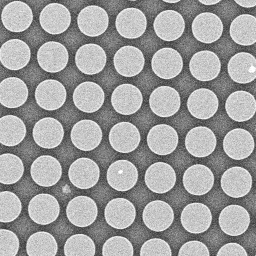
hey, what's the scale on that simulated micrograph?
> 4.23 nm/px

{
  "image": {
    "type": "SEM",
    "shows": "an array of small figures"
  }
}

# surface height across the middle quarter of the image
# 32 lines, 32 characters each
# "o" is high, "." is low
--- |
...ooooooo...ooooooo..ooooooo..o
....ooooo....oooooo...ooooooo...
......o.......oooo.....ooooo....
........................ooo.....
......o.........................
....ooooo.....oooo..............
...ooooooo...oooooo....ooooo....
..oooooooo..ooooooo...oooooo....
..oooooooo..oooooooo.oooooooo..o
..oooooooo..ooooooo..oooooooo..o
...oooooo...ooooooo...ooooooo..o
....oooo.....ooooo....oooooo...o
...............oo......oooo.....
................................
....ooo.........................
..ooooooo....ooooo.....ooo......
..ooooooo...oooooo....oooooo....
..ooooooo..oooooooo..ooooooo...o
..ooooooo..oooooooo..ooooooo...o
..ooooooo...ooooooo..ooooooo..oo
...ooooo....oooooo...ooooooo..oo
....oo.......oooo.....ooooo....o
........................oo......
................................
...ooooo.....ooo................
..oooooo....oooooo....oooo......
.oooooooo..ooooooo...oooooo....o
.oooooooo..ooooooo..oooooooo..oo
.oooooooo..ooooooo..oooooooo..oo
..oooooo...ooooooo..oooooooo..oo
...oooo.....ooooo....oooooo...oo
.............ooo......oooo.....o